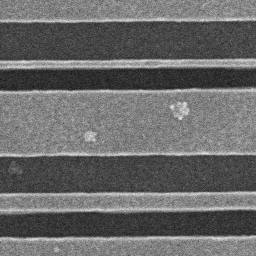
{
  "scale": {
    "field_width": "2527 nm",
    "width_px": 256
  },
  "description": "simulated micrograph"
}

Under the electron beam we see lines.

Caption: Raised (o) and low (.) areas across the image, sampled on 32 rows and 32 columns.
oooooooooooooooooooooooooooooooo
oooooooooooooooooooooooooooooooo
oooooooooooooooooooooooooooooo..
................................
................................
................................
................................
................................
................................
................................
................................
o..ooooooooooooooooooooooooooooo
oooooooooooooooooooooooooooooooo
oooooooooooooooooooooooooooooooo
oooooooooooooooooooooooooooooooo
oooooooooooooooooooooooooooooooo
oooooooooooooooooooooooooooooooo
oooooooooooooooooooooooooooooooo
oooooooooooooooooooooooooooooooo
ooooo...........................
................................
................................
................................
................................
oooooooooooooooooooooooooooooooo
oooooooooooooooooooooooooooooooo
................................
................................
................................
................................
oooooooooooooooooooooooooooooooo
oooooooooooooooooooooooooooooooo